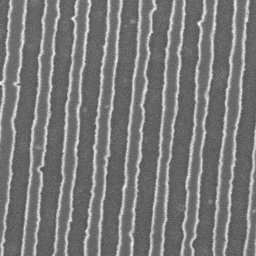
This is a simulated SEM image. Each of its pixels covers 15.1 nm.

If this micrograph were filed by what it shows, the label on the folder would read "parallel lines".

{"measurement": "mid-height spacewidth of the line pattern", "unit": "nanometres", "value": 295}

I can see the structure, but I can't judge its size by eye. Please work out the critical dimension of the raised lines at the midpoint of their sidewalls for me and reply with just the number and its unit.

184 nm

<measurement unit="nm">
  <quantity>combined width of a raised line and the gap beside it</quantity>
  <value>479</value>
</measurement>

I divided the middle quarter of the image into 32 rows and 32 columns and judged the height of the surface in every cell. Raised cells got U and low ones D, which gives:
DDUUUDDDDDUUUDDDDDUUUDDDDDUUUDDD
DDUUUDDDDUUUUDDDDDUUDDDDDUUUUDDD
DDUUDDDDDUUUUDDDDDUUDDDDDUUUUDDD
DDUUDDDDDUUUUDDDDUUUUDDDDUUUUDDD
DDUUDDDDDUUUUDDDDUUUUDDDDUUUUDDD
DUUUDDDDDUUUDDDDDUUUUDDDDUUUUDDD
DUUUDDDDDUUUDDDDDUUUDDDDDUUUUDDD
DUUUDDDDDUUUDDDDDUUUDDDDDUUUDDDD
DUUUDDDDDUUUDDDDDUUUDDDDDUUUDDDD
DUUUDDDDDUUUDDDDDUUUDDDDDUUUDDDD
DUUUDDDDDUUUDDDDDUUUDDDDDUUUDDDD
DUUUDDDDDUUUDDDDDUUUDDDDDUUUDDDD
DUUDDDDDDUUUDDDDDUUUDDDDDUUUDDDD
DUUUDDDDUUUUDDDDDUUUDDDDDUUUDDDD
DUUUDDDDUUUDDDDDDUUUDDDDDUUUDDDD
DUUUDDDDUUUDDDDDUUUUDDDDUUUDDDDD
UUUUDDDDUUUDDDDDUUUDDDDDUUUDDDDD
DUUDDDDDUUUDDDDDUUUDDDDDUUUDDDDD
UUUDDDDDUUUDDDDDUUUDDDDDUUUDDDDD
UUUDDDDDUUUDDDDDUUUDDDDDUUUDDDDD
UUUDDDDDUUUDDDDDUUUDDDDDUUUDDDDD
UUUDDDDDUUUDDDDDUUUDDDDDUUUDDDDD
UUUDDDDDUUUDDDDDUUUDDDDDUUUDDDDD
UUUDDDDDUUUDDDDDUUUDDDDDUUUDDDDD
UUUDDDDDUUUDDDDDUUUDDDDDUUDDDDDD
UUUDDDDDUUDDDDDUUUDDDDDDUUDDDDDD
UUUDDDDDUUUDDDDUUUUDDDDDUUDDDDDU
UUUDDDDDUUDDDDDUUUDDDDDDUUDDDDDU
UUUDDDDUUUDDDDDDUUDDDDDUUUDDDDDU
UUDDDDDUUUDDDDDUUUDDDDDUUUDDDDDU
UUDDDDDUUUDDDDDUUUDDDDDUUUDDDDDU
UUDDDDDUUUDDDDDUUUDDDDDUUUDDDDDU